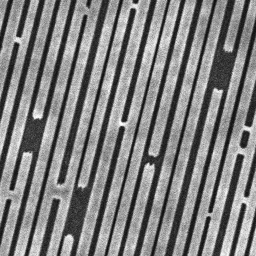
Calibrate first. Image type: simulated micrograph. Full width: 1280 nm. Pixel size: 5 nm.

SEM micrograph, parallel lines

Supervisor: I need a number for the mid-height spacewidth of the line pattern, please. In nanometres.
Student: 27.9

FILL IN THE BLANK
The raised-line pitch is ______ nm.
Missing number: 76.4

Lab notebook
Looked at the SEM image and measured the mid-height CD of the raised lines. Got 51.6 nanometres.